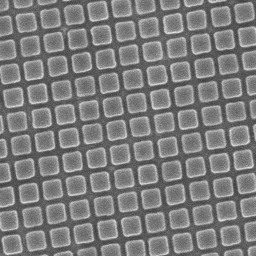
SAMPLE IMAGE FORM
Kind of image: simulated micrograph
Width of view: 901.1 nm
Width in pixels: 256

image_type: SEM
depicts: a regular array of raised bodies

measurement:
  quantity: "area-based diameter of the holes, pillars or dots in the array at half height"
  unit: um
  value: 0.0728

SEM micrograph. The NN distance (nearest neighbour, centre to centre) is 83.8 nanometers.